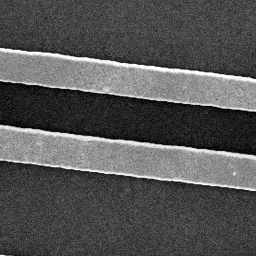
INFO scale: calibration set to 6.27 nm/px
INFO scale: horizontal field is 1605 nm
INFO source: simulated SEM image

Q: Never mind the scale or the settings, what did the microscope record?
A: lines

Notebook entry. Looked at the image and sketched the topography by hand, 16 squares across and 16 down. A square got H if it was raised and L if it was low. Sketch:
LLLLLLLLLLLLLLLL
LLLLLLLLLLLLLLLL
LLLLLLLLLLLLLLLL
HHHHLLLLLLLLLLLL
HHHHHHHHHHHHLLLL
LLLHHHHHHHHHHHHH
LLLLLLLLLLLLHHHH
LLLLLLLLLLLLLLLL
HHHHHLLLLLLLLLLL
HHHHHHHHHHHHHHLL
LLLLHHHHHHHHHHHH
LLLLLLLLLLLLHHHH
LLLLLLLLLLLLLLLL
LLLLLLLLLLLLLLLL
LLLLLLLLLLLLLLLL
LLLLLLLLLLLLLLLL